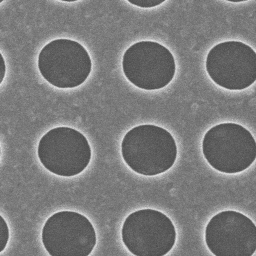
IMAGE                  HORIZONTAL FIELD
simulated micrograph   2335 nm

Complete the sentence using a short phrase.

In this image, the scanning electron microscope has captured holes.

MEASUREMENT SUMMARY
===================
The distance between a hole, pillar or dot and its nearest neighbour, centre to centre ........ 0.769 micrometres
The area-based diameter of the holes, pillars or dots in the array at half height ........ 51.4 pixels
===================